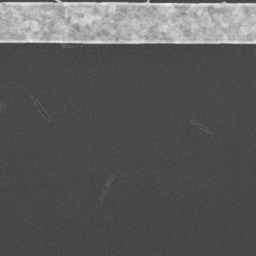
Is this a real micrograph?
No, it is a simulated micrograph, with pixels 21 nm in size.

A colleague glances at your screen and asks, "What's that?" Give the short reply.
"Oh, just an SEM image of wiring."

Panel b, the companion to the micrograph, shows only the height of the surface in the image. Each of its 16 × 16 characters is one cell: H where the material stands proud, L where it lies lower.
HHHHHHHHHHHHHHHH
HHHHHHHHHHHHHHHH
HHHHHHHHHHHHHHHH
LLLLLLLLLLLLLLLL
LLLLLLLLLLLLLLLL
LLLLLLLLLLLLLLLL
LLLLLLLLLLLLLLLL
LLLLLLLLLLLLLLLL
LLLLLLLLLLLLLLLL
LLLLLLLLLLLLLLLL
LLLLLLLLLLLLLLLL
LLLLLLLLLLLLLLLL
LLLLLLLLLLLLLLLL
LLLLLLLLLLLLLLLL
LLLLLLLLLLLLLLLL
LLLLLLLLLLLLLLLL